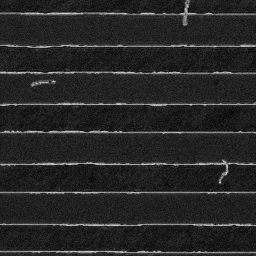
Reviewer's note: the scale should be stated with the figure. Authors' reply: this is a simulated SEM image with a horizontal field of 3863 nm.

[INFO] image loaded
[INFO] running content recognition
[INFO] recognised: lines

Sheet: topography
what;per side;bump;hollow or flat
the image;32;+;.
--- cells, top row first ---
................................
.......................+........
++++++++++++++++++++++++++++++++
++++++++++++++++++++++++++++++++
++++++++++++++++++++++++++++++++
++++++++++++++++++++++++++++++++
................................
................................
................................
++++++++++++++++++++++++++++++++
++++++++++++++++++++++++++++++++
++++++++++++++++++++++++++++++++
++++++++++++++++++++++++++++++++
................................
................................
................................
+..+++++++++++..................
++++++++++++++++++++++++++++++++
++++++++++++++++++++++++++++++++
++++++++++++++++++++++++++++++++
++++++++++.+++++++++++++++++++++
................................
................................
................................
++++++++++++++++++++++++++++++++
++++++++++++++++++++++++++++++++
++++++++++++++++++++++++++++++++
++++++++++++++++++++++++++++++++
................................
................................
................................
++++++++++++++++.+.++....+......